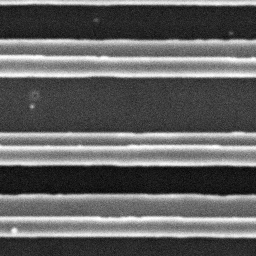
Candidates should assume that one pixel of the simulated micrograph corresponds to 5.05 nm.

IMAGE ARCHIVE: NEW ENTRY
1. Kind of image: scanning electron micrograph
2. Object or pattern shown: lines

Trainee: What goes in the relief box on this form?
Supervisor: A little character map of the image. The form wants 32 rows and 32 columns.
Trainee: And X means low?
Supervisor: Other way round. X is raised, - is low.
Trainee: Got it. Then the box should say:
---------------------------XXX-X
--------------------------------
--------------------------------
--------------------------------
--------------------------------
XXXXXXXXXXXXXXXXXXXXXXXXXXXXXXXX
XXXXXXXXXXXXXXXXXXXXXXXXXXXXXXXX
XXXXXXXXXXXXXXXXXXXXXXXXXXXXXXXX
XXXXXXXXXXXXXXXXXXXXXXXXXXXXXXXX
-------XXX-----XXX------XXX-XXXX
--------------------------------
--------------------------------
--------------------------------
--------------------------------
--------------------------------
--------------------------------
--------------------------------
XXXXXXXXXXXXXXXXXXXXXXXXXXXXXXXX
XXXXXXXXXXXXXXXXXXXXXXXXXXXXXXXX
XXXXXXXXXXXXXXXXXXXXXXXXXXXXXXXX
XXXXXXXXXXXXXXXXXXXXXXXXXXXXXXXX
--------------------------------
--------------------------------
--------------------------------
XXXXXXXXXXXXXXXXXXXXXXXXXXX-XXXX
XXXXXXXXXXXXXXXXXXXXXXXXXXXXXXXX
XXXXXXXXXXXXXXXXXXXXXXXXXXXXXXXX
XXXXXXXXXXXXXXXXXXXXXXXXXXXXXXXX
XXXXXXXXXXXXXXXXXXXXXXXXXXXXXXXX
---------------------------X-XXX
--------------------------------
--------------------------------